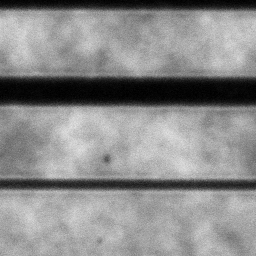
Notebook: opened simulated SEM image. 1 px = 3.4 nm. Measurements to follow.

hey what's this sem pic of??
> one or a few lines or trenches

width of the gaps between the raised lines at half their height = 221 nm